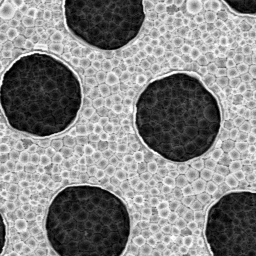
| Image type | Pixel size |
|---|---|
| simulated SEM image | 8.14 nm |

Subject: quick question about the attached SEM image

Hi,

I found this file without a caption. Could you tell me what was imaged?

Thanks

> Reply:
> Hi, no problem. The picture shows holes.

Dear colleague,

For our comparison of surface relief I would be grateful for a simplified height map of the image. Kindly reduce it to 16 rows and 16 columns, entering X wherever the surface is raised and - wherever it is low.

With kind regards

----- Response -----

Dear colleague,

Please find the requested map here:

XXXX-----XXXXXX-
XXXX-----XXXXXXX
XXXXX---XXXXXXXX
XX-XXXXXXXXXXXXX
-----XXXXXXXXXXX
-----XXXX----XXX
-----XXXX-----XX
-----XXX------XX
XX-XXXXXX-----XX
XXXXXXXXXX---XXX
XXXXXXXXXXXXXXXX
XXXXXXXXXXXXXXXX
XXX-----XXXXXX--
XXX-----XXXXX---
XXX-----XXXXX---
XXX-----XXXXX---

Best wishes